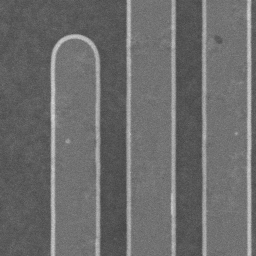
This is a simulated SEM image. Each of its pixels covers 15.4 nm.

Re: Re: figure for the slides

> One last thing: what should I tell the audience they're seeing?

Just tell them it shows groups of lines, slits or small figures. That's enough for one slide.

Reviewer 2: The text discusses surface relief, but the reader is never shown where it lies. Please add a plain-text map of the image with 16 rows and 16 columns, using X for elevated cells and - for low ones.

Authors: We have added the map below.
--------XXX--XXX
--------XXX--XXX
----X---XXX--XXX
---XXX--XXX--XXX
---XXX--XXX--XXX
---XXX--XXX--XXX
---XXX--XXX--XXX
---XXX--XXX--XXX
---XXX--XXX--XXX
---XXX--XXX--XXX
---XXX--XXX--XXX
---XXX--XXX--XXX
---XXX--XXX--XXX
---XXX--XXX--XXX
---XXX--XXX--XXX
---XXX--XXX--XXX